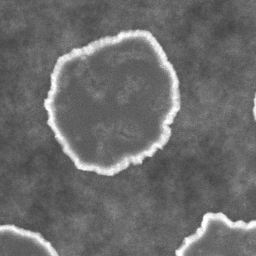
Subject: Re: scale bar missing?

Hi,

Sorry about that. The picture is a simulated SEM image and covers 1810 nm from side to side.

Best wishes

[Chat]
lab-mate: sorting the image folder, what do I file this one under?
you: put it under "raised bodies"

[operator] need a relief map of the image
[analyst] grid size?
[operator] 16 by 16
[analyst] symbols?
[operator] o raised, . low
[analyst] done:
................
................
.......ooo......
....oooooo......
...oooooooo.....
...oooooooo.....
...oooooooo.....
...oooooooo.....
....oooooo......
....ooooo.......
.....oo.........
................
................
.............o..
oo..........oooo
ooo........ooooo